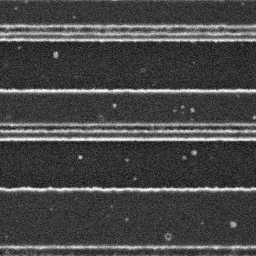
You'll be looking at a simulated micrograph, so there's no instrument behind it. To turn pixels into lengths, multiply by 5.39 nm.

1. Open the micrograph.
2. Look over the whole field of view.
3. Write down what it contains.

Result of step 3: lines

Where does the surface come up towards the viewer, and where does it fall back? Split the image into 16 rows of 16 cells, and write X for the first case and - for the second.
XXXXXXXXXXXXXXXX
XXXXXXXXXXXXXXXX
----------------
----------------
----------------
----------------
XXXXXXXXXXXXXXXX
XXXXXXXXXXXXXXXX
XXXXXXXXXXXXXXXX
----------------
----------------
----------------
XXXXXXXXXXXXXXXX
XXXXXXXXXXXXXXXX
XXXXXXXXXXXXXXXX
XXXXXXXXXXXXXXXX